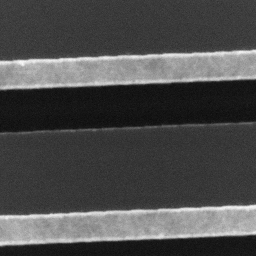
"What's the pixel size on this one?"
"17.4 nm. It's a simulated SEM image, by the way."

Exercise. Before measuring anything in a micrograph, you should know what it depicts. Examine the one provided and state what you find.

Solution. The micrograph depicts lines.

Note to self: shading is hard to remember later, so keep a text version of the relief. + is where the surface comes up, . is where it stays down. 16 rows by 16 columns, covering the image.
++++++++++++++++
++++++++++++++++
++++++++++++++++
++++++++++++++++
++++++++++++++++
+...............
................
................
++++++++++++++++
++++++++++++++++
++++++++++++++++
++++++++++++++++
++++++++++++++++
++++++++++++++++
++++++++++++++++
................